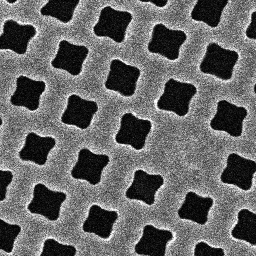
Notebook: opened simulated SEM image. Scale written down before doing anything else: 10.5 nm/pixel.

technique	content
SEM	a regular array of holes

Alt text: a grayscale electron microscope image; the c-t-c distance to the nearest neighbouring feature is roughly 577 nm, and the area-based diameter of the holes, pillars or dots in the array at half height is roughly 354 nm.